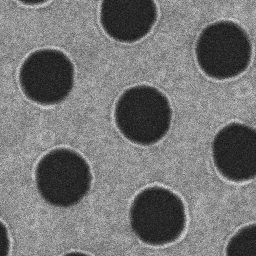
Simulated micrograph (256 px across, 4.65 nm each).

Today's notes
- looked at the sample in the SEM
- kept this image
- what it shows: holes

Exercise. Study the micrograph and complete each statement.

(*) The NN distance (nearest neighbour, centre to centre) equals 0.475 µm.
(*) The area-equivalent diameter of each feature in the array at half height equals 257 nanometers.